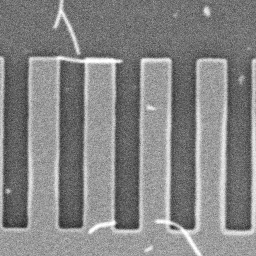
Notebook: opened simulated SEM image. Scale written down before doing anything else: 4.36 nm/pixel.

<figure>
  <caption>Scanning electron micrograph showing groups of lines, slits or small figures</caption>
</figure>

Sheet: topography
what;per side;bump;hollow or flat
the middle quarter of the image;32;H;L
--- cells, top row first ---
LLLLLHHHHHHHHLLLLLLHHHHHHHHLLLLL
LLLLLHHHHHHHHLLLLLLHHHHHHHHLLLLL
LLLLLHHHHHHHHLLLLLLHHHHHHHHLLLLL
LLLLLHHHHHHHHLLLLLLHHHHHHHHLLLLL
LLLLLHHHHHHHHLLLLLLHHHHHHHHLLLLL
LLLLLHHHHHHHHLLLLLLHHHHHHHHLLLLL
LLLLLHHHHHHHHLLLLLLHHHHHHHHLLLLL
LLLLLHHHHHHHHLLLLLLHHHHHHHHLLLLL
LLLLLHHHHHHHHLLLLLLHHHHHHHHLLLLL
LLLLLHHHHHHHHLLLLLLHHHHHHHHLLLLL
LLLLLHHHHHHHHLLLLLLHHHHHHHHLLLLL
LLLLLHHHHHHHHLLLLLLHHHHHHHLLLLLL
LLLLLHHHHHHHHLLLLLLHHHHHHHLLLLLL
LLLLLHHHHHHHHLLLLLLHHHHHHHLLLLLL
LLLLLHHHHHHHHLLLLLLHHHHHHHLLLLLL
LLLLLHHHHHHHHLLLLLLHHHHHHHLLLLLL
LLLLLHHHHHHHHLLLLLLHHHHHHHLLLLLL
LLLLLHHHHHHHLLLLLLLHHHHHHHLLLLLL
LLLLLHHHHHHHLLLLLLLHHHHHHHLLLLLL
LLLLLHHHHHHHLLLLLLLHHHHHHHLLLLLL
LLLLLHHHHHHHLLLLLLLHHHHHHHLLLLLL
LLLLLHHHHHHHLLLLLLLHHHHHHHLLLLLL
LLLLLHHHHHHHLLLLLLLHHHHHHHLLLLLL
LLLLLHHHHHHHLLLLLLLHHHHHHHLLLLLL
LLLLLHHHHHHHLLLLLLLHHHHHHHLLLLLL
LLLLLHHHHHHHLLLLLLLHHHHHHHLLLLLL
LLLLLHHHHHHHLLLLLLLHHHHHHHLLLLLL
LLLLLHHHHHHHLLLLLLLHHHHHHHLLLLLL
LLLLLHHHHHHHLLLLLLLHHHHHHHLLLLLL
LLLLLHHHHHHHLLLLLLLHHHHHHHLLLLLL
LLLLLHHHHHHHLLLLLLLHHHHHHHLLLLLL
LLLLLHHHHHHHLLLLLLLHHHHHHHLLLLLL